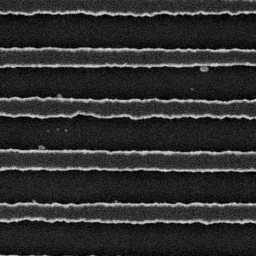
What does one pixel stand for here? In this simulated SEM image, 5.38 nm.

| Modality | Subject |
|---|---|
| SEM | lines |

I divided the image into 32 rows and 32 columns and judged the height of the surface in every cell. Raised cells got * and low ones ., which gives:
********************************
********************************
................................
................................
................................
................................
********************************
********************************
................................
................................
................................
................................
************.*..****.*........*.
********************************
.********...***********.********
................................
................................
................................
................................
********************************
********************************
................................
................................
................................
................................
*.***......*****.*.*..*.***..*..
********************************
***.****************************
................................
................................
................................
................................